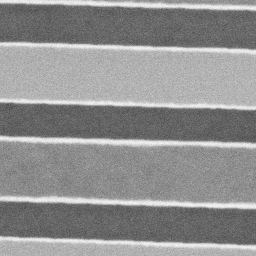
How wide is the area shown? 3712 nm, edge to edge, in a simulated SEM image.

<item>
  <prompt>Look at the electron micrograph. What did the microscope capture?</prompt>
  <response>lines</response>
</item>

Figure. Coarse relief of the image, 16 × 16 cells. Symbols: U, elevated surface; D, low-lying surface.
DDDDDDDDDDDUUUUU
DDDDDDDDDDDDDDDD
DDDDDDDDDDDDDDDD
UUUUUUUUUUUUUUUU
UUUUUUUUUUUUUUUU
UUUUUUUUUUUUUUUU
DDDDDUUUUUUUUUUU
DDDDDDDDDDDDDDDD
DDDDDDDDDDDDDDDD
UUUUUUUUUUUUUUUU
UUUUUUUUUUUUUUUU
UUUUUUUUUUUUUUUU
DUUUUUUUUUUUUUUU
DDDDDDDDDDDDDDDD
DDDDDDDDDDDDDDDD
UUUUUUUUUUUUUUUU